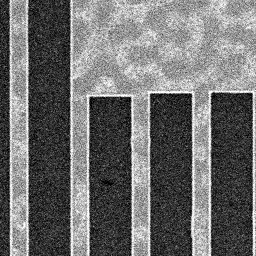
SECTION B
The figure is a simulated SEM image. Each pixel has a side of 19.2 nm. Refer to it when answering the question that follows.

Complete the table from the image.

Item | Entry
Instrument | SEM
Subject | parallel lines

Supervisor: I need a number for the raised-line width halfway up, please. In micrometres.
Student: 0.325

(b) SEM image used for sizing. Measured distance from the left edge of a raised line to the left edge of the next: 60.7 pixels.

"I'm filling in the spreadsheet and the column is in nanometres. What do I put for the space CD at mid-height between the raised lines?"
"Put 839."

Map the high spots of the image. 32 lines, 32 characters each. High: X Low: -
-XX------XXXXXXXXXXXXXXXXXXXXXXX
-XX------XXXXXXXXXXXXXXXXXXXXXXX
-XX------XXXXXXXXXXXXXXXXXXXXXXX
-XX------XXXXXXXXXXXXXXXXXXXXXXX
-XX------XXXXXXXXXXXXXXXXXXXXXXX
-XX------XXXXXXXXXXXXXXXXXXXXXXX
-XX------XXXXXXXXXXXXXXXXXXXXXXX
-XX------XXXXXXXXXXXXXXXXXXXXXXX
-XX------XXXXXXXXXXXXXXXXXXXXXXX
-XX------XXXXXXXXXXXXXXXXXXXXXXX
-XX------XXXXXXXXXXXXXXXXXXXXXXX
-XX------XXXXXXXXXX-----XXX----X
-XX------XX------XX-----XX------
-XX------XX------XX-----XX------
-XX------XX------XX-----XX------
-XX------XX------XX-----XX------
-XX------XX------XX-----XX------
-XX------XX-----XXX-----XX------
-XX------XX------XX-----XX------
-XX------XX------XX-----XX------
-XX------XX------XX-----XX------
-XX------XX------XX-----XX------
-XX------XX------XX-----XX------
-XX------XX------XX-----XX------
-XX------XX------XX-----XX------
-XX------XX------XX-----XX------
-XX------XX------XX-----XX------
-XX------XX------XX-----XX------
-XX------XX------XX-----XX------
-XX------XX------XX-----XX------
-XX------XX------XX-----XX------
-XX------XX------XX-----XX------